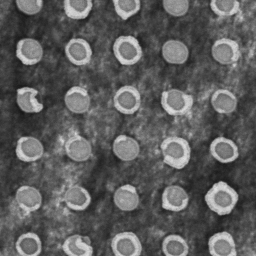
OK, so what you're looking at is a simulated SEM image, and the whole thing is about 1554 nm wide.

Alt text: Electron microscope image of a regular array of raised bodies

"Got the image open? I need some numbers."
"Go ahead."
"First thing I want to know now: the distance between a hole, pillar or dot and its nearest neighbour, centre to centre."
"292 nanometers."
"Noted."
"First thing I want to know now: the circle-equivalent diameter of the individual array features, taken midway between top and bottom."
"156 nm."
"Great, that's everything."